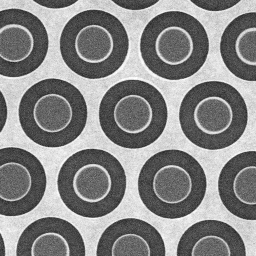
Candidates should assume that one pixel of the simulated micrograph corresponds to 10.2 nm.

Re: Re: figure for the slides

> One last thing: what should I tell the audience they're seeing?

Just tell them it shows an array of small figures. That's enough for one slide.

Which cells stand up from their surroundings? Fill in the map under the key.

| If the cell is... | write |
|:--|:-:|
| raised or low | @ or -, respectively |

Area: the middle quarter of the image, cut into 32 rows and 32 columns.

@--------------@@@@@------------
@@------------@@@@@@@-----------
@@@---------@@@@@@@@@@----------
@@@@@@----@@@@@@@@@@@@@@-------@
-@@@@@@@@@@@@@-------@@@@@@@@@@@
---@@@@@@@@@-----------@@@@@@@@@
----@@@@@@@-------------@@@@@@@-
----@@@@@@---------------@@@@@--
-----@@@@@-----@@@@------@@@@@--
@----@@@@-----@@@@@@@----@@@@---
@-----@@@----@@@@@@@@-----@@@---
@@----@@@----@@@@@@@@@----@@@---
@@----@@@----@@@@@@@@@----@@@---
@@----@@@----@@@@@@@@@----@@@---
@-----@@@----@@@@@@@@-----@@@---
@----@@@@-----@@@@@@@----@@@@---
-----@@@@------@@@@------@@@@---
----@@@@@@--------------@@@@@@--
---@@@@@@@@-------------@@@@@@@-
--@@@@@@@@@@-----------@@@@@@@@@
@@@@@@@@@@@@@@-------@@@@@@@@@@@
@@@@-----@@@@@@@@@@@@@@@@@---@@@
@@----------@@@@@@@@@@@--------@
@------------@@@@@@@@-----------
--------------@@@@@@------------
------@@@------@@@@@------------
----@@@@@@-----@@@@-----@@@@@@--
---@@@@@@@@----@@@@----@@@@@@@@-
---@@@@@@@@-----@@-----@@@@@@@@-
---@@@@@@@@@----@@----@@@@@@@@@@
---@@@@@@@@@----@@----@@@@@@@@@@
---@@@@@@@@----@@@-----@@@@@@@@@